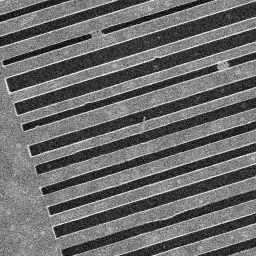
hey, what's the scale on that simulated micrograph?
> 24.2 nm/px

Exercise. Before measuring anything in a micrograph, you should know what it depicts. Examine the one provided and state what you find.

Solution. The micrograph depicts parallel lines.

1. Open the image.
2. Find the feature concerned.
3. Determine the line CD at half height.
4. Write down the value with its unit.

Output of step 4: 11.9 pixels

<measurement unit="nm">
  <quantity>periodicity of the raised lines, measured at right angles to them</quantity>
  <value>539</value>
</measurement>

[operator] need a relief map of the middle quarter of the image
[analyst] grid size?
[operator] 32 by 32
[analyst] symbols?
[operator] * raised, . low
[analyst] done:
........*********...........****
.....*********...........*******
..*********...........********..
********...........********.....
****...........********.......**
*...........********.......*****
.........*******........********
......********.......***********
...*******........***********...
*******.......************......
****.......************.........
........************..........**
.....***********..........******
.************..........********.
**********..........*******.....
*******..........*******........
***...........*******.........**
..........********.........*****
.......********.........********
....*******..........**********.
.*******.........**********.....
****..........**********........
**.........**********........***
........**********.......*******
.....**********.......**********
.**********........**********...
********........**********......
*****.......**********........**
**.......**********.........****
......**********........********
...**********.......**********..
**********.......**********.....